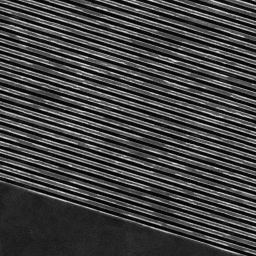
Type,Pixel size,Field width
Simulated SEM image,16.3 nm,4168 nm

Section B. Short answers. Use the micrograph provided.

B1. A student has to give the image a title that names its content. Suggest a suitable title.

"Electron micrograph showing parallel lines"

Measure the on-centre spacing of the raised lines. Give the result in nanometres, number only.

123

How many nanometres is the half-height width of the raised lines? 68.1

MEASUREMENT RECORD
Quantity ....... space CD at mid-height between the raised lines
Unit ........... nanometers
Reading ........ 60.3